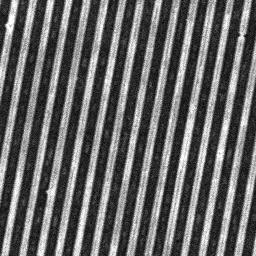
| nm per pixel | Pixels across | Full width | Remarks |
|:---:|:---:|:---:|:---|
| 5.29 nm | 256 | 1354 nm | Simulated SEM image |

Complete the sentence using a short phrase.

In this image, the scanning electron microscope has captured parallel lines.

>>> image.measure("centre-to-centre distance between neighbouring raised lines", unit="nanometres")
93.3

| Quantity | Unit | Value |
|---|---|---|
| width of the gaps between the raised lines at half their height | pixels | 10.7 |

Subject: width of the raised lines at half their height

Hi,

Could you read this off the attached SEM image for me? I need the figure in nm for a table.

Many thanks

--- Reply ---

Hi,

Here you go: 36.3